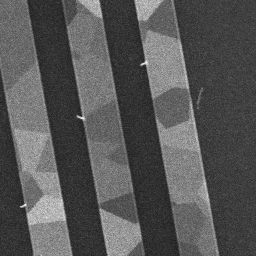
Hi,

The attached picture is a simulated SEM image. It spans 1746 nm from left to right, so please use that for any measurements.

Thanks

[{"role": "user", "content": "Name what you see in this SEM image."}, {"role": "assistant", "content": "one or a few lines or trenches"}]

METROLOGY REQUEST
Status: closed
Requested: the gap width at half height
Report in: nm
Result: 243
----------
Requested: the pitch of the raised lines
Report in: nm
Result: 491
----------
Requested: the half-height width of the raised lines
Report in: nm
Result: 249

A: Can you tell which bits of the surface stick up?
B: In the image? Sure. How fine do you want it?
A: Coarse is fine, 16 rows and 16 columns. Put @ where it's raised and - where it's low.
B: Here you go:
@@--@@---@@-----
@@--@@---@@-----
@@--@@@--@@-----
@@--@@@--@@-----
@@---@@--@@@----
@@@--@@--@@@----
@@@--@@---@@----
-@@--@@@--@@----
-@@--@@@--@@----
-@@---@@--@@----
-@@@--@@--@@@---
-@@@--@@---@@---
--@@--@@---@@---
--@@--@@@--@@---
--@@--@@@--@@---
--@@---@@--@@@--